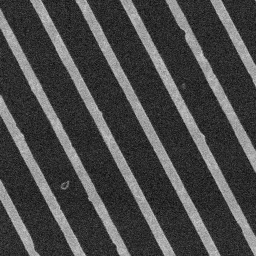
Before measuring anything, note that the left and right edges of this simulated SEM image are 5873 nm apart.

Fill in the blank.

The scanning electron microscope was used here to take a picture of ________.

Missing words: parallel lines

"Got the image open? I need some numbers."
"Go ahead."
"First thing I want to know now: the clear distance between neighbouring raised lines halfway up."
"716 nanometres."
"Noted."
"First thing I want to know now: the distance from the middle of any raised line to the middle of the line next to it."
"914 nanometres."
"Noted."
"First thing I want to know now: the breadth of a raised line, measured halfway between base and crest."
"0.196 um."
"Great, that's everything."